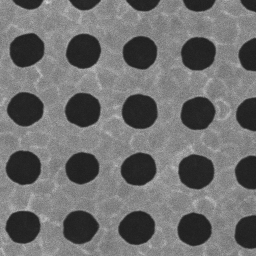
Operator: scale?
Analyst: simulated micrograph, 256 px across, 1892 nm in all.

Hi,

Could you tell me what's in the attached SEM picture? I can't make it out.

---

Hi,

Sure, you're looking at a regular array of holes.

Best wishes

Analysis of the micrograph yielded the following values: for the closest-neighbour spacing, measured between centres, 420 nanometres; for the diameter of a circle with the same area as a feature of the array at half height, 254 nanometers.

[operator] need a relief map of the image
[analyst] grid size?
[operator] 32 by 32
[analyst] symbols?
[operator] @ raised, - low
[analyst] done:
@@---@@@@---@@@@----@@@----@@@--
@@@@@@@@@@@@@@@@@@@@@@@@@@@@@@@@
@@@@@@@@@@@@@@@@@@@@@@@@@@@@@@@@
@@@@@@@@@@@@@@@@@@@@@@@@@@@@@@@@
@@---@@@@---@@@@@@@@@@@@@@@@@@@@
@-----@@@---@@@@---@@@@----@@@--
@----@@@-----@@-----@@@----@@@--
@@---@@@----@@@@---@@@@----@@@--
@@@@@@@@@@-@@@@@@-@@@@@@--@@@@--
@@@@@@@@@@@@@@@@@@@@@@@@@@@@@@@@
@@@@@@@@@@@@@@@@@@@@@@@@@@@@@@@@
@@@@@@@@@@@@@@@@@@@@@@@@@@@@@@@@
@----@@@@---@@@@---@@@@@--@@@@@-
@----@@@-----@@-----@@@----@@@--
@----@@@----@@@-----@@@----@@@--
@@--@@@@@---@@@@---@@@@---@@@@--
@@@@@@@@@@@@@@@@@@@@@@@@@@@@@@@@
@@@@@@@@@@@@@@@@@@@@@@@@@@@@@@@@
@@@@@@@@@@@@@@@@@@@@@@@@@@@@@@@@
@----@@@@---@@@@---@@@@--@@@@@@@
@----@@@----@@@----@@@-----@@@--
@----@@@----@@@----@@@-----@@---
@----@@@@---@@@@---@@@@----@@@--
@@@@@@@@@@@@@@@@@@@@@@@@-@@@@@@-
@@@@@@@@@@@@@@@@@@@@@@@@@@@@@@@@
@@@@@@@@@@@@@@@@@@@@@@@@@@@@@@@@
@@--@@@@@--@@@@@--@@@@@@@@@@@@@@
@----@@@----@@@----@@@@---@@@@--
@----@@@----@@@----@@@----@@@---
@----@@@----@@@----@@@----@@@---
@@@@@@@@@@@@@@@@--@@@@@--@@@@@--
@@@@@@@@@@@@@@@@@@@@@@@@@@@@@@@@